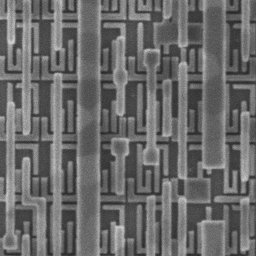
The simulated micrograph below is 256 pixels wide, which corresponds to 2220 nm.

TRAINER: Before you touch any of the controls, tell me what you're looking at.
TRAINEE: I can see wiring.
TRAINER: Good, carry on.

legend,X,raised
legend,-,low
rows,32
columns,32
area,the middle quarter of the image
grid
----XXXXX----XX-----XXX------XX-
----XXXXX----XX------XX------XX-
----XXXXX---XXXX-----XX------XX-
----XXXXX---XXXX-----XX------XX-
----XXXXX----XXX-----XX--XX--XX-
----XXXXX----XX------XX--XX--XX-
----XXXXX----XX------XX--XX--XX-
----XXXXX----XX------XX--XX--XX-
----XXXXX----XX------XX--XX--XX-
----XXXXX----XX------XX--XX--XX-
----XXXXX----XX------XX--XX--XX-
----XXXXX----XX------XX--XX--XX-
----XXXXX----XX------XX--XX--XX-
----XXXXX------------XX--XX--XX-
----XXXXX------------XX--XX--XX-
----XXXXX------------XX--XX--XX-
----XXXXX------------XX--XX--XX-
----XXXXX------------XX--XX--XX-
----XXXXX------------XX------XX-
----XXXXX---XXXX-----XX------XX-
----XXXXX---XXXX-----XX------XX-
----XXXXX---XXXX----XXXX-----XX-
----XXXXX---XXXX----XXXX-----XX-
---XXXXXX----XX-----XXXX-----XX-
---XXXXXX----XX-----XXXX-----XX-
----XXXXX----XX--------------XX-
----XXXXX----XX--------------XX-
----XXXXX----XX--------------XX-
----XXXXX----XX--------------XX-
---XXXXXX----XX-----------------
---XXXXXX----XX----------XX-----
----XXXXX----XX----------XX-----